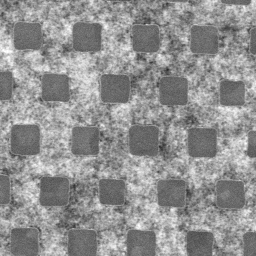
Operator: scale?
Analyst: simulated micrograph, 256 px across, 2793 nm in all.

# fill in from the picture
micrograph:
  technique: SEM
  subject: a regular array of raised bodies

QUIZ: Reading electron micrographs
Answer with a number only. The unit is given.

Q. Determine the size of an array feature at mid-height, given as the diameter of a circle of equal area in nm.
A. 354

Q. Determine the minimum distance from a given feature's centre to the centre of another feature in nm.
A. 639